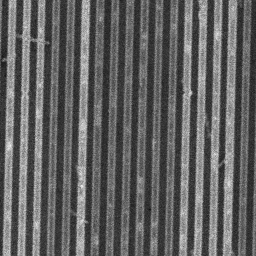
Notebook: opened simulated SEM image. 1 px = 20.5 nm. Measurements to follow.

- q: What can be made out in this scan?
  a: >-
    parallel lines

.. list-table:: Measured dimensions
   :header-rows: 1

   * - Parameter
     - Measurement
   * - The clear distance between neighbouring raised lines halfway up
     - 172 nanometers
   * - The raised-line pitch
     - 301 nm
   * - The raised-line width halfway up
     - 133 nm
